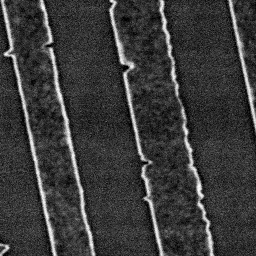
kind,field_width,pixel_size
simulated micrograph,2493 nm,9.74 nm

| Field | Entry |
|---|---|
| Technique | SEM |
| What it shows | one or a few lines or trenches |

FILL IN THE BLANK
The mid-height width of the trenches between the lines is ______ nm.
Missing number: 651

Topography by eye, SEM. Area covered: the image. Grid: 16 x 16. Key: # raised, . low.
###....###....##
###....###.....#
.##....####....#
.##.....###....#
.##.....###....#
.###....###.....
..##....###.....
..##....####....
..##.....###....
..###....###....
..###....###....
...##....###....
...##....####...
...##.....###...
...###....###...
...###....###...